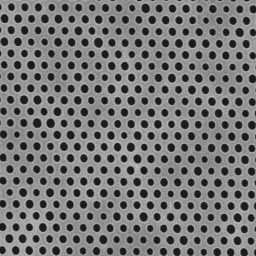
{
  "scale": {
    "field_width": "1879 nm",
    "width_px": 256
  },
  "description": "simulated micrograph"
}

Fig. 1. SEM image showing a regular array of holes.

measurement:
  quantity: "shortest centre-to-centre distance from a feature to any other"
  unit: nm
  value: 95.9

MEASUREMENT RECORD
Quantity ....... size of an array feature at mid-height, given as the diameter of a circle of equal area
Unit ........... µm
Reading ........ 0.0536